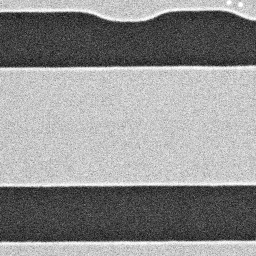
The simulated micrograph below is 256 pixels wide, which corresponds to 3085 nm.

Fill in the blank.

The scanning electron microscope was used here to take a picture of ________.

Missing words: wiring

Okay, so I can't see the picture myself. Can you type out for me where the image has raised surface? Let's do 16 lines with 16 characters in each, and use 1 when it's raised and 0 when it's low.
1111111111111111
0000000000000000
0000000000000000
0000000000000000
1111111111111111
1111111111111111
1111111111111111
1111111111111111
1111111111111111
1111111111111111
1111111111111111
1111111111111111
0000000000000000
0000000000000000
0000000000000000
1111111111111111